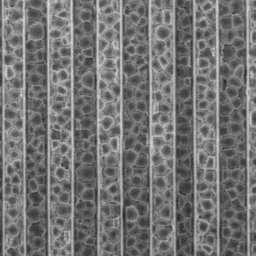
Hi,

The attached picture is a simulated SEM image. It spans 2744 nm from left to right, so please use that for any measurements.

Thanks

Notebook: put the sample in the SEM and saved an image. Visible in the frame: parallel lines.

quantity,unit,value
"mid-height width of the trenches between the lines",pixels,25.9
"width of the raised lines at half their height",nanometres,249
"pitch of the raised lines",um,0.516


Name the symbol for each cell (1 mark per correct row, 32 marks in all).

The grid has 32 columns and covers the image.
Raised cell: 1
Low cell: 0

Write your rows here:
11100011100011100001110011100001
11100011100011100001110011100001
11100011100011100001110011100001
11100011100011100001110011100001
11100011100011100001110011100001
11100011100011100001110011100001
11100011100011100001110011100001
11100011100011100001110011100001
11100011100011100001110011100001
11100011100011100001110011100001
11100011100011100001110011100001
11100011100011100001110011100001
11100011100011100001110011100001
11100011100011100001110011100001
11100011100011100001110011100001
11100011100011100001110011100001
11100011100011100001110011100001
11100011100011100001110011100001
11100011100011100001110011100001
11100011100011100001110011100001
11100011100011100001110011100001
11100011100011100001110011100001
11100011100011100001110011100001
11100011100011100001110011100001
11100011100011100001110011100001
11100011100011100001110011100001
11100011100011100001110011100001
11100011100011100001110011100001
11100011100011100001110011100001
11100011100011100001110011100001
11100011100011100001110011100001
11100011100011100001110011100001